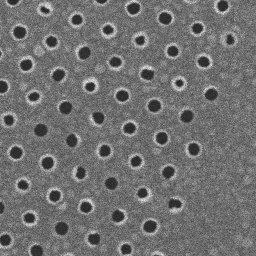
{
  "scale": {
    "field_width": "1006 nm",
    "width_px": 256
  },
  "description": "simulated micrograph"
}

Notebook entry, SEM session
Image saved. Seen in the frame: a regular array of holes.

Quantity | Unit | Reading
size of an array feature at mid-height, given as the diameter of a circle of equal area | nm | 45.5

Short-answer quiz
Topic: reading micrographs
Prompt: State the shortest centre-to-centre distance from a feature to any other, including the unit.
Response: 128 nm